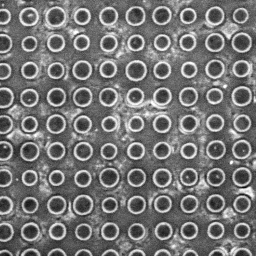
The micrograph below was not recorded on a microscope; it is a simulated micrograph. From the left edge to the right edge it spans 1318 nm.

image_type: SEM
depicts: a regular array of raised bodies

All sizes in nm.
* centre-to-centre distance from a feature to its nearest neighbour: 135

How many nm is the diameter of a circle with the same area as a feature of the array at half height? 83.6